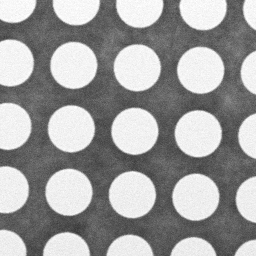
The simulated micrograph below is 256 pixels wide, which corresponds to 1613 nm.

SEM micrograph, an array of small figures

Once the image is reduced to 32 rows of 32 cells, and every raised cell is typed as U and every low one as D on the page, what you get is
UUUUDDDUUUUUDDDUUUUUDDDUUUUUDDUU
UUUUDDDUUUUUDDDUUUUUDDDUUUUUDDUU
UUUDDDDDUUUDDDDUUUUUDDDUUUUUDDDU
DDDDDDDDDDDDDDDDDDDDDDDDUUDDDDDD
DDDDDDDDDDDDDDDDDDDDDDDDDDDDDDDD
UUUDDDDDUUDDDDDDDDDDDDDDDDDDDDDD
UUUUDDDUUUUUDDDUUUUDDDDUUUUDDDDD
UUUUDDUUUUUUDDUUUUUUDDDUUUUUDDDU
UUUUDDUUUUUUDDUUUUUUDDUUUUUUDDUU
UUUUDDDUUUUUDDDUUUUUDDUUUUUUDDUU
UUDDDDDUUUUDDDDUUUUDDDDUUUUDDDDU
DDDDDDDDDDDDDDDDDDDDDDDDUUDDDDDU
DDDDDDDDDDDDDDDDDDDDDDDDDDDDDDDD
UUUDDDDDUUDDDDDDDDDDDDDDDDDDDDDD
UUUUDDDUUUUDDDDUUUUDDDDUUUUDDDDU
UUUUDDUUUUUUDDUUUUUUDDUUUUUDDDUU
UUUUDDUUUUUUDDUUUUUUDDUUUUUUDDUU
UUUDDDUUUUUDDDUUUUUUDDUUUUUUDDUU
UUDDDDDUUUUDDDDUUUUDDDUUUUUDDDUU
DDDDDDDDDDDDDDDDDDDDDDDDUDDDDDDU
DDDDDDDDDDDDDDDDDDDDDDDDDDDDDDDD
UUDDDDDUUUDDDDDDUDDDDDDDDDDDDDDD
UUUDDDUUUUUDDDUUUUUDDDDUUUDDDDDU
UUUDDDUUUUUDDDUUUUUDDDUUUUUDDDUU
UUUDDDUUUUUDDDUUUUUDDDUUUUUDDDUU
UUUDDDUUUUUDDDUUUUUDDDUUUUUDDDUU
UDDDDDDUUUDDDDDUUUDDDDUUUUUDDDUU
DDDDDDDDDDDDDDDDDDDDDDDDDDDDDDDU
DDDDDDDDDDDDDDDDDDDDDDDDDDDDDDDD
UUDDDDDUUUDDDDDDUDDDDDDDDDDDDDDD
UUUDDDUUUUUDDDUUUUDDDDUUUUDDDDDU
UUUDDDUUUUUDDUUUUUUDDUUUUUUDDDUU